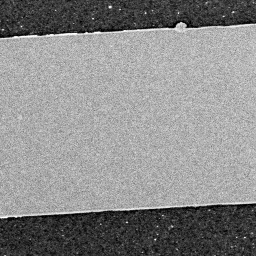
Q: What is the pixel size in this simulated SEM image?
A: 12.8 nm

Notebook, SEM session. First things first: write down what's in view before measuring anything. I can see one or a few lines or trenches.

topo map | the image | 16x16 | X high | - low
----------------
----------------
XXXXXXXXXXXXXXXX
XXXXXXXXXXXXXXXX
XXXXXXXXXXXXXXXX
XXXXXXXXXXXXXXXX
XXXXXXXXXXXXXXXX
XXXXXXXXXXXXXXXX
XXXXXXXXXXXXXXXX
XXXXXXXXXXXXXXXX
XXXXXXXXXXXXXXXX
XXXXXXXXXXXXXXXX
XXXXXXXXXXXXXXXX
X---------------
----------------
----------------